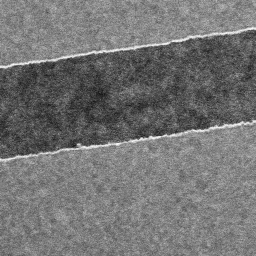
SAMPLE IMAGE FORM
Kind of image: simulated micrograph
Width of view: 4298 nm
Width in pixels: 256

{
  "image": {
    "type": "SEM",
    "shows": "one or a few lines or trenches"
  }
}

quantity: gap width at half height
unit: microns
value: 1.54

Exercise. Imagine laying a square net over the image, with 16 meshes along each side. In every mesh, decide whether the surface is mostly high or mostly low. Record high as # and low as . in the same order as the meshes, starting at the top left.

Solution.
################
################
###########.....
#####...........
................
................
................
................
..........######
...#############
################
################
################
################
################
################